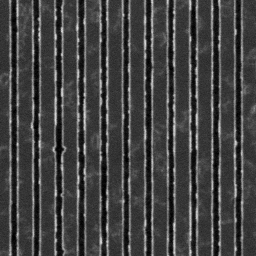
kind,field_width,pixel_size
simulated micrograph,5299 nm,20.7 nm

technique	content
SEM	parallel lines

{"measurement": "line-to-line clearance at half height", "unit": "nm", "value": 308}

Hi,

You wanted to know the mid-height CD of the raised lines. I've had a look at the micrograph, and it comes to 160 nanometers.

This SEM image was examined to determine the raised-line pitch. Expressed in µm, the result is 0.465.